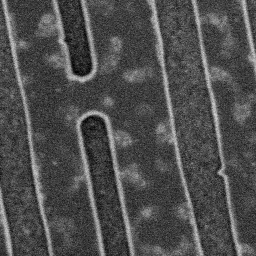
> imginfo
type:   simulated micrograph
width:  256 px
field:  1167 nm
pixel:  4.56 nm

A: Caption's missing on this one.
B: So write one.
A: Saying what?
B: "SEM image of one or a few lines or trenches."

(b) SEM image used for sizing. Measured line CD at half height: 246 nm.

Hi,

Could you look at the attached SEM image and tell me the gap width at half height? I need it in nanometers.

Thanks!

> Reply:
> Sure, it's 166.